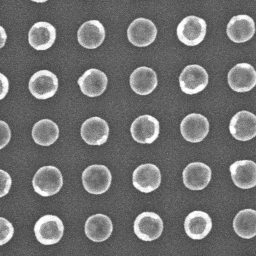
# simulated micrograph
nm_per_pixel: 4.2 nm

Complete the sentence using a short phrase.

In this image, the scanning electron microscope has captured a regular array of raised bodies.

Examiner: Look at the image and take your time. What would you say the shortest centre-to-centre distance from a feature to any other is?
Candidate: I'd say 203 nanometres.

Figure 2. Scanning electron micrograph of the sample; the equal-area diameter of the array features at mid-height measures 119 nanometers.